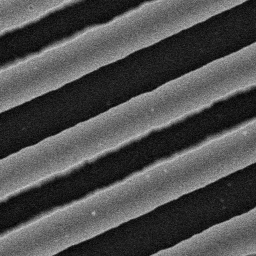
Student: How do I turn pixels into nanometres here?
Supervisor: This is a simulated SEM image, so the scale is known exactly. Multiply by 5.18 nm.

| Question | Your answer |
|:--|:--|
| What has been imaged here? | lines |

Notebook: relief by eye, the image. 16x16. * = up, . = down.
****.....*****..
*......*****....
....******......
..******......**
******......****
****......*****.
*.......*****...
.....******.....
...******.....**
.******.....****
****.....******.
**.....******...
.....******.....
...******......*
.*****.......***
****.......*****